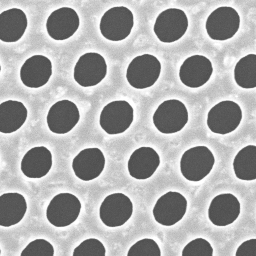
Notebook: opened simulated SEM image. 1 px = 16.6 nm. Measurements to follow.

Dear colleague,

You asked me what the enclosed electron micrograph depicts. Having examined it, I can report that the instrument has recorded a regular array of holes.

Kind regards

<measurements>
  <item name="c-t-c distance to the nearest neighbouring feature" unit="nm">870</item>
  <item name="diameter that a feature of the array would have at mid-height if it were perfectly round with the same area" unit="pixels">34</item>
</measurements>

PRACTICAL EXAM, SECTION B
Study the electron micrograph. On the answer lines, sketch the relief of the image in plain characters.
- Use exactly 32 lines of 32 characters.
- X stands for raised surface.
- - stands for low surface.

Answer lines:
XXXXXXXXXXXXXXXXXXXXXXXXXXXXXXXX
---XXXX---XXX---XXXX---XXX----XX
---XXX----XXX----XX-----XX----XX
---XXX----XX-----XX----XXX----XX
---XXX---XXXX---XXXX---XXX---XXX
XXXXXXXXXXXXXXXXXXXXXXXXXXXXXXXX
XXXXXXXXXXXXXXXXXXXXXXXXXXXXXXXX
XXX---XXXX---XXXX---XXX---XXXX--
XXX----XX----XXX----XXX----XX---
XXX---XXX----XXX----XX----XXX---
XXX---XXXX--XXXX---XXXX---XXXX--
XXXXXXXXXXXXXXXXXXXXXXXXXXXXXXXX
XXXXXXXXXXXXXXXXXXXXX-XXXXXXXXXX
---XXX----XXX----XXX---XXXX---XX
---XXX----XX-----XX-----XX----XX
---XXX----XX----XXX----XXX----XX
--XXXXX--XXXX--XXXXX--XXXXX--XXX
XXXXXXXXXXXXXXXXXXXXXXXXXXXXXXXX
XXXX--XXXXX-XXXXX--XXXXX--XXXX--
XXX---XXXX---XXX----XXX----XX---
XXX---XXX----XXX----XXX----XX---
XXX---XXX----XXX---XXXX---XXX---
XXXXXXXXXX-XXXXXXXXXXXX--XXXXX-X
XXXXXXXXXXXXXXXXXXXXXXXXXXXXXXXX
---XXXX--XXXXX--XXXX---XXXX--XXX
---XXX----XXX---XXX----XXX----XX
---XXX----XX----XXX----XXX----XX
---XXX---XXXX---XXXX--XXXX---XXX
XXXXXXXXXXXXXXXXXXXXXXXXXXXXXXXX
XXXXXXXXXXXXXXXXXXXXXXXXXXXXXXXX
XXXX--XXXX---XXXX---XXX---XXXX--
XXX----XX----XXX----XXX----XX---